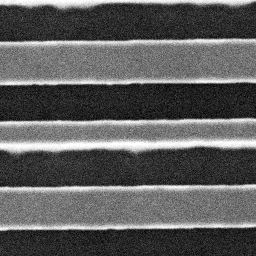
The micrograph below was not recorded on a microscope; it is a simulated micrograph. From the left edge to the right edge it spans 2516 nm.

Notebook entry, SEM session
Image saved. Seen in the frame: lines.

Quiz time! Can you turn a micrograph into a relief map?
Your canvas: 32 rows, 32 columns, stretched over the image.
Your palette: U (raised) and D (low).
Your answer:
DDDDDDDDDDDDDDDDDDDDDDDDDDDDDDDD
DDDDDDDDDDDDDDDDDDDDDDDDDDDDDDDD
DDDDDDDDDDDDDDDDDDDDDDDDDDDDDDDD
DDDDDDDDDDDDDDDDDDDDDDDDDDDDDDDD
DDDDDDDDDDDDDDDDDDDDDDDDDDDDDDDD
UUUUUUUUUUUUUUUUUUUUUUUUUUUUUUUU
UUUUUUUUUUUUUUUUUUUUUUUUUUUUUUUU
UUUUUUUUUUUUUUUUUUUUUUUUUUUUUUUU
UUUUUUUUUUUUUUUUUUUUUUUUUUUUUUUU
UUUUUUUUUUUUUUUUUUUUUUUUUUUUUUUU
UUUDDDDDDDDDDDDDDDDDDDDDDDDDDDDD
DDDDDDDDDDDDDDDDDDDDDDDDDDDDDDDD
DDDDDDDDDDDDDDDDDDDDDDDDDDDDDDDD
DDDDDDDDDDDDDDDDDDDDDDDDDDDDDDDD
DDDDDDDDDDDDDDDDDDDDDDDDDDDDDDDD
UUUUUUUUUUUUUUUUUUUUUUUUUUUUUUUU
UUUUUUUUUUUUUUUUUUUUUUUUUUUUUUUU
UUUUUUUUUUUUUUUUUUUUUUUUUUUUUUUU
DDDDDDDDDDDDDDDDDDDDDDDDDDDDDDDD
DDDDDDDDDDDDDDDDDDDDDDDDDDDDDDDD
DDDDDDDDDDDDDDDDDDDDDDDDDDDDDDDD
DDDDDDDDDDDDDDDDDDDDDDDDDDDDDDDD
DDDDDDDDDDDDDDDDDDDDDDDDDDDDDDDD
DDDDDDDDDUUUUUUUUUUUUUUUUUUUUUUU
UUUUUUUUUUUUUUUUUUUUUUUUUUUUUUUU
UUUUUUUUUUUUUUUUUUUUUUUUUUUUUUUU
UUUUUUUUUUUUUUUUUUUUUUUUUUUUUUUU
UUUUUUUUUUUUUUUUUUUUUUUUUUUUUUUU
UUUUUUUUUDUUUUDDDDDDDDDDDDDDDDDD
DDDDDDDDDDDDDDDDDDDDDDDDDDDDDDDD
DDDDDDDDDDDDDDDDDDDDDDDDDDDDDDDD
DDDDDDDDDDDDDDDDDDDDDDDDDDDDDDDD